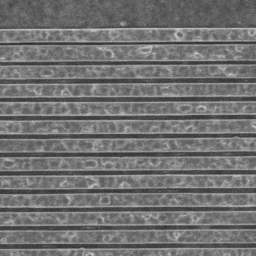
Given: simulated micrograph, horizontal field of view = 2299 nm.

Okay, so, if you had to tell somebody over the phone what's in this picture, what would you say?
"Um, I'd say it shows parallel lines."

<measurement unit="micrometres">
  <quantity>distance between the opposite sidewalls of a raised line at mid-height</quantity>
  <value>0.121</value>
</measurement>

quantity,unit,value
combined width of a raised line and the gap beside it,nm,164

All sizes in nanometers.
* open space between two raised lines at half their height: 44.9